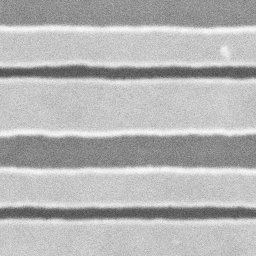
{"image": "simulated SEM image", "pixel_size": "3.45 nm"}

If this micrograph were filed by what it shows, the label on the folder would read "lines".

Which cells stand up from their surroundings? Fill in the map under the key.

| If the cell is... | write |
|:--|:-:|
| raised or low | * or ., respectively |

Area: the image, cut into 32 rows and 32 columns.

................................
................................
................................
*...*****.......................
********************************
********************************
********************************
********************************
................................
................................
********************************
********************************
********************************
********************************
********************************
********************************
********************************
................................
................................
................................
................................
********************************
********************************
********************************
********************************
********************************
................................
................................
********************************
********************************
********************************
********************************